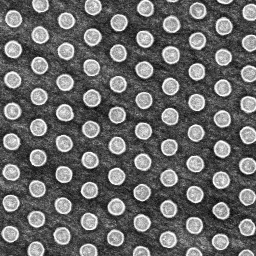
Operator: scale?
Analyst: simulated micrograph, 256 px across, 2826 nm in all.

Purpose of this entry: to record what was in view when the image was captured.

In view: a regular array of raised bodies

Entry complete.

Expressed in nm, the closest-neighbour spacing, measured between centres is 332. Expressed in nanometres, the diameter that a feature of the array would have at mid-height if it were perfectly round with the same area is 181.